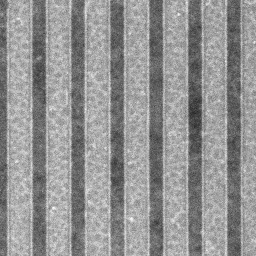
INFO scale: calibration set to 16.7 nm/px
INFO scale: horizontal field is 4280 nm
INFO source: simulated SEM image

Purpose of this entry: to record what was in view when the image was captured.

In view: parallel lines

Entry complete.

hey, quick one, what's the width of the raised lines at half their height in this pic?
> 272 nm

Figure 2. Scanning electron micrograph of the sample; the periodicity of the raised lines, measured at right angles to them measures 0.651 micrometres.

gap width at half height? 378 nm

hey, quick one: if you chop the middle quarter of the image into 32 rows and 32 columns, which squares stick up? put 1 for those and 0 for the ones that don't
00111000000011100000011110000001
00111000000011100000011110000001
00111000000011100000011110000001
00111000000011100000011110000001
00111000000011100000011110000001
00111000000011100000011110000001
00111000000011100000011110000001
00111000000011100000011110000001
10111000000011100000011110000001
00111000000011100000011110000001
00111000000011100000011110000001
00111000000011100000011110000001
00111000000011100000011110000001
00111000000011100000011110000001
00111000000011100000011110000001
00111000000011100000011110000001
00111000000011100000011110000001
00111000000011100000011110000001
00111000000011100000011110000001
00111000000011100000011110000001
00111000000011100000011110000001
00111000000011100000011110000001
00111000000011100000011110000001
00111000000011100000011110000001
00111000000011100000011110000001
00111000000011100000011110000001
00111000000011100000011110000001
00111000000011100000011110000001
00111000000011100000011110000001
00111000000011100000011110000001
00111000000011100000011110000001
00111000000011100000011110000001